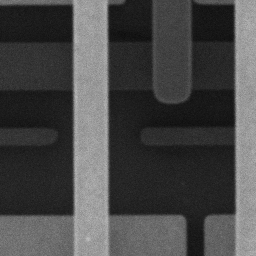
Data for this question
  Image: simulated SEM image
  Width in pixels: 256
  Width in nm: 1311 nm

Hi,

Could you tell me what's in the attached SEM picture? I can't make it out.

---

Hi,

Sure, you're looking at wiring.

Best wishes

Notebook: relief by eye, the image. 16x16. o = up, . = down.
.....oo...oo...o
.....oo...oo...o
.....oo...oo...o
.....oo...oo...o
.....oo...oo...o
.....oo...oo...o
.....oo........o
.....oo........o
.....oo........o
.....oo........o
.....oo........o
.....oo........o
.....oo........o
.....oo........o
.....oo........o
.....oo........o